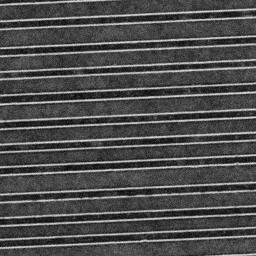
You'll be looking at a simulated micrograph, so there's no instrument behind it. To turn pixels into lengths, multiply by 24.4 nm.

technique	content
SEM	parallel lines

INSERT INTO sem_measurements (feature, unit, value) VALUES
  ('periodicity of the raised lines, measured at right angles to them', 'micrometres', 0.592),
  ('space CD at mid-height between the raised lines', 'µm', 0.391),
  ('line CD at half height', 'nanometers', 195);